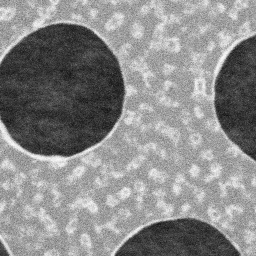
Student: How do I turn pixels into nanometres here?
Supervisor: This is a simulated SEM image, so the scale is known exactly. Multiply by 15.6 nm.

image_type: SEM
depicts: holes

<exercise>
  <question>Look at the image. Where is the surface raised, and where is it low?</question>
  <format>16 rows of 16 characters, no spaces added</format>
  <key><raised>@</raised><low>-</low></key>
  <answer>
@@@@@@@@@@@@@@@@
@@@--@@@@@@@@@@@
@-----@@@@@@@@@-
-------@@@@@@@--
--------@@@@@@--
--------@@@@@---
--------@@@@@---
-------@@@@@@@--
-------@@@@@@@--
@@---@@@@@@@@@@-
@@@@@@@@@@@@@@@@
@@@@@@@@@@@@@@@@
@@@@@@@@@@@@@@@@
@@@@@@@@@@@@@@@@
@@@@@@@@@-----@@
@@@@@@@--------@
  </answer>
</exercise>